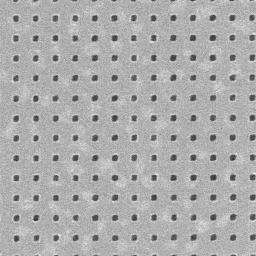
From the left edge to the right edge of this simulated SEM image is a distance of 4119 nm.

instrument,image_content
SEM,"a regular array of holes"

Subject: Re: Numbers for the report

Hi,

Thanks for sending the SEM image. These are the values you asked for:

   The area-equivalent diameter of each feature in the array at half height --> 0.113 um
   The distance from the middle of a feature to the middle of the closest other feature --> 0.314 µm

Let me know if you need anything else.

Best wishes